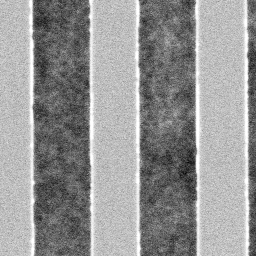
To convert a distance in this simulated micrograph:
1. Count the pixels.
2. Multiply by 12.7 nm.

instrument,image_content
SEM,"lines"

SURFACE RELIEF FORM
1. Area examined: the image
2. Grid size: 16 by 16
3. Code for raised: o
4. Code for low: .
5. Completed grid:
oo....ooo...ooo.
oo....ooo...ooo.
oo....ooo...ooo.
oo....ooo...ooo.
oo....ooo...ooo.
oo....ooo...ooo.
oo....ooo...ooo.
oo....ooo...ooo.
oo....ooo...ooo.
oo....ooo...ooo.
oo....ooo...ooo.
oo....ooo...ooo.
oo....ooo...ooo.
oo....ooo...ooo.
oo....ooo...ooo.
oo....ooo...ooo.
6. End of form